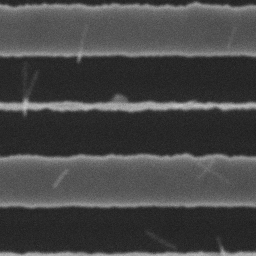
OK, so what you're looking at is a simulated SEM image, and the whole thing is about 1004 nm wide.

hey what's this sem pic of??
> lines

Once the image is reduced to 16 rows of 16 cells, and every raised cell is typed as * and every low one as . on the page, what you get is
****************
****************
****************
**.**...*.......
................
................
....*...*.......
................
................
................
****************
****************
****************
................
................
................